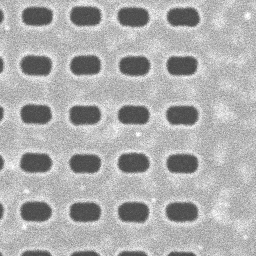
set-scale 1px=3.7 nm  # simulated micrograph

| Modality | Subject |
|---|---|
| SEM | a regular array of holes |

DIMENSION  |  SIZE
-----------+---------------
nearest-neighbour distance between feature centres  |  0.178 micrometres